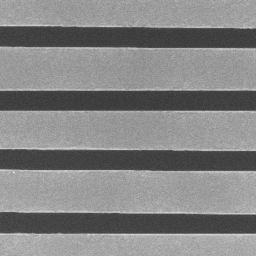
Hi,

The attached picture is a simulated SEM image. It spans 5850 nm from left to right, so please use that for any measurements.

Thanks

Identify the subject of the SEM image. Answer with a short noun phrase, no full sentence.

lines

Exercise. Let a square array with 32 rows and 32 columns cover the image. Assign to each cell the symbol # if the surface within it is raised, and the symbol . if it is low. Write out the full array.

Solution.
################################
################################
################################
.............................###
................................
................................
################################
################################
################################
################################
################################
................................
................................
................................
################################
################################
################################
################################
################################
................................
................................
################################
################################
################################
################################
################################
..##############################
................................
................................
################################
################################
################################